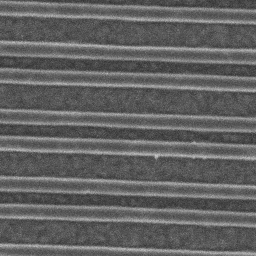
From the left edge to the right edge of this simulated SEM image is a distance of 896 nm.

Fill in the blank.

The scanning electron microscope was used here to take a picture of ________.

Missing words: parallel lines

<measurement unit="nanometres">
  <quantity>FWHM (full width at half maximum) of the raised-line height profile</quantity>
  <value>47.7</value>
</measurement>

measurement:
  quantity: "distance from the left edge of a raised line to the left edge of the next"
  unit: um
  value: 0.118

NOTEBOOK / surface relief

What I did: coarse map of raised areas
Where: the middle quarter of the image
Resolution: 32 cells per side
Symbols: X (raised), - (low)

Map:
--------------------------------
--------------------------------
XXXXXXXXXXXXXXXXXXX--XXX--------
XXXXXXXXXXXXXXXXXXXXXXXXXXXXXXXX
XXXXXXXXXXXXXXXXXXXXXXXXXXXXXXXX
-------------XXXXXXXXXXXXXXXXXXX
--------------------------------
--------------------------------
--------------------------------
--------------------------------
--------------------------------
--------------------------------
XXXXXXXXXXXXX-------------------
XXXXXXXXXXXXXXXXXXXXXXXXXXXXXXXX
XXXXXXXXXXXXXXXXXXXXXXXXXXXXXXXX
----------XXXXXXXXXXXXXXXXXXXXXX
--------------------------------
--------------------------------
--------------------------------
XXXXXXXXXXXXXXXXXXXXXXXX--------
XXXXXXXXXXXXXXXXXXXXXXXXXXXXXXXX
XXXXXXXXXXXXXXXXXXXXXXXXXXXXXXXX
--------------XXXXXXXXXXXXXXXXXX
--------------------------------
--------------------------------
--------------------------------
--------------------------------
--------------------------------
--------------------------------
XXXXXXXXXXXXXXXXXXXX------------
XXXXXXXXXXXXXXXXXXXXXXXXXXXXXXXX
XXXXXXXXXXXXXXXXXXXXXXXXXXXXXXXX